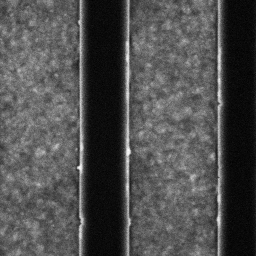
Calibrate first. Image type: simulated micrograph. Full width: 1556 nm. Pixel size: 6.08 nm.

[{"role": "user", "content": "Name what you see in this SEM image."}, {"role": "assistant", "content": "one or a few lines or trenches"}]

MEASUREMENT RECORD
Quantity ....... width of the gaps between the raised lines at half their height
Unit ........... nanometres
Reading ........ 544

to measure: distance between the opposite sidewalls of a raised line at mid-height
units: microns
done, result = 0.299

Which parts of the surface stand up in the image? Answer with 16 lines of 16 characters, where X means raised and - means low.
-----XXX------XX
-----XXX------XX
-----XXX------XX
-----XXX------XX
-----XXX------XX
-----XXX------XX
-----XXX------XX
-----XXX------XX
-----XXX------XX
-----XXX------XX
-----XXX------XX
-----XXX------XX
-----XXX------XX
-----XXX------XX
-----XXX------XX
-----XXX------XX